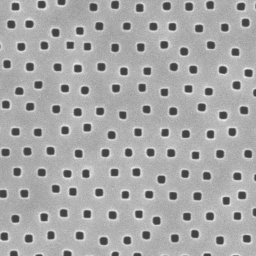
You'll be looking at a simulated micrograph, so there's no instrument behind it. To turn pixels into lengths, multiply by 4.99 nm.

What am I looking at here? a regular array of holes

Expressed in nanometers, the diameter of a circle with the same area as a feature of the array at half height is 43.6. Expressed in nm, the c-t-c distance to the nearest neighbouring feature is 100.